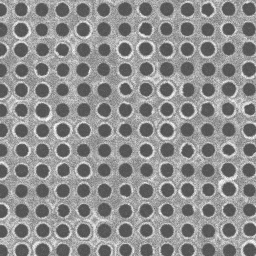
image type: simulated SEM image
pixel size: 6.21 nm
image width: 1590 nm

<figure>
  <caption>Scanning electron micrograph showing a regular array of holes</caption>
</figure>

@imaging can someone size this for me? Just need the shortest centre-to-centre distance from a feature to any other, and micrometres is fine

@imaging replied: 0.123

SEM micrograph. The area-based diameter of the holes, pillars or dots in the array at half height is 83.4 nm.